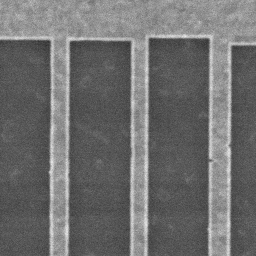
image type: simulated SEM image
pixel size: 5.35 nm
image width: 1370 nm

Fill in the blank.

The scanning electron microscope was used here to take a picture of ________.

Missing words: one or a few lines or trenches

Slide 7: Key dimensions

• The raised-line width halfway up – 85.6 nanometers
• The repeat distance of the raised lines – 428 nm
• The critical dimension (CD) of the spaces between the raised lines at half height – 342 nm